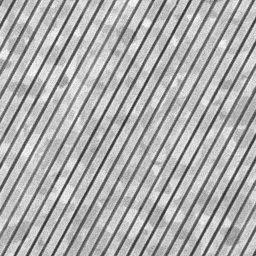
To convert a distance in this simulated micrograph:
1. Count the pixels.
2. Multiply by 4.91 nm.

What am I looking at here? parallel lines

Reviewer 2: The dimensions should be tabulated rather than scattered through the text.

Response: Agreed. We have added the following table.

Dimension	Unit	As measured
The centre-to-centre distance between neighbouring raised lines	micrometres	0.0543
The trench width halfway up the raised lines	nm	14.6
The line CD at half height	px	7.92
